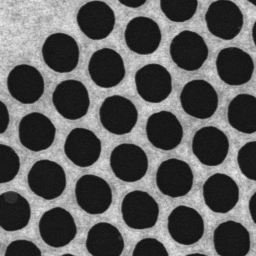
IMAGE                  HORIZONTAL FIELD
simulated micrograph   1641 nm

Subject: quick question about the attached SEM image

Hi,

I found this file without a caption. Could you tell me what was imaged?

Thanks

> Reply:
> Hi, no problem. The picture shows a regular array of holes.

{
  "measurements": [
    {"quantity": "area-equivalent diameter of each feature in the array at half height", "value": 0.245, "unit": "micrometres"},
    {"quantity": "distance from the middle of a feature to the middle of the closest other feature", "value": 305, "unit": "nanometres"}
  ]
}